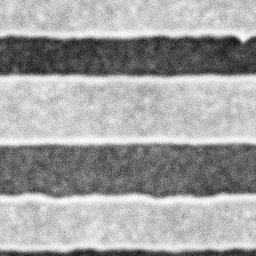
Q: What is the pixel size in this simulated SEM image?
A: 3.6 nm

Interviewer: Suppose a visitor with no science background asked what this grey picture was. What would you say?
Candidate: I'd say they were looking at one or a few lines or trenches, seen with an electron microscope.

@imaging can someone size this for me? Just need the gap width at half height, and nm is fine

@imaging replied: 177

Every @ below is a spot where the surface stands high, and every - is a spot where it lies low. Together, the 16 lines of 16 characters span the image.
@@@@@@@@@@@@@@@@
@@@@@@@@@@@@@@@@
----------------
----------------
----------------
@@@@@@@@@@@@@@@@
@@@@@@@@@@@@@@@@
@@@@@@@@@@@@@@@@
@@@@@@@@@@@@@@@@
----------------
----------------
----------------
@@@@@@@@@@@@@@@@
@@@@@@@@@@@@@@@@
@@@@@@@@@@@@@@@@
@@@@@-@--@@@@@--